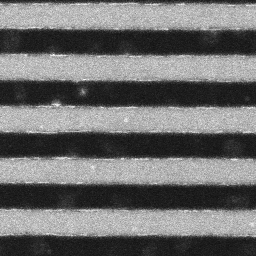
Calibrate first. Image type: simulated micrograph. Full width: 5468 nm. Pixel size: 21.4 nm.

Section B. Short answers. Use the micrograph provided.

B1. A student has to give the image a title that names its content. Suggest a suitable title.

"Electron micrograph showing parallel lines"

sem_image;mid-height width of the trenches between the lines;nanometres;510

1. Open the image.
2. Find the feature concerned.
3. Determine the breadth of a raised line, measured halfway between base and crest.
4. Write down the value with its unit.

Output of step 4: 0.595 um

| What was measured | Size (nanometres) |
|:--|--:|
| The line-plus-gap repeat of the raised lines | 1100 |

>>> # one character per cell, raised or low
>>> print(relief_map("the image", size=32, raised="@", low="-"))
@@@---@@@@@@@@-@-@@@-@@--@-@@@@@
--------------------------------
--------------------------------
@--@@@@-------------------------
@@@@@@@@@@@@@@@@@@@@@@@@@@@@@@@@
@@@@@@@@@@@@@@@@@@@@@@@@@@@@@@@@
@@@@@@@@@@@@@@@@@@@@@@@@@@@@@@@@
--------------------------------
--------------------------------
--------------------------------
@@@@@@@@@@@@@@@@@@@@@@@@@@@@@@@@
@@@@@@@@@@@@@@@@@@@@@@@@@@@@@@@@
@@@@@@@@@@@@@@@@@@@@@@@@@@@@@@@@
--------------@-------@@-@-@----
--------------------------------
--------------------------------
@@@----@@@@@@@@@@@@@@@@@---@--@-
@@@@@@@@@@@@@@@@@@@@@@@@@@@@@@@@
@@@@@@@@@@@@@@@@@@@@@@@@@@@@@@@@
@@@@@@@@@@@@@@@@@@@@@@@@@@@@@@@@
--------------------------------
--------------------------------
--------------------------------
@@@@@@@@@@@@@@@@@@@@@@@@@@@@@@@@
@@@@@@@@@@@@@@@@@@@@@@@@@@@@@@@@
@@@@@@@@@@@@@@@@@@@@@@@@@@@@@@@@
--------------------------------
--------------------------------
--------------------------------
@@@@@@@@@@@@@@@@@@@@@@@@@@@@@@@@
@@@@@@@@@@@@@@@@@@@@@@@@@@@@@@@@
@@@@@@@@@@@@@@@@@@@@@@@@@@@@@@@@